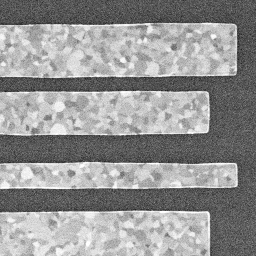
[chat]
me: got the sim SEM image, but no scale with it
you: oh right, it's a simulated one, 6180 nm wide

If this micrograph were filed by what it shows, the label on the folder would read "groups of lines, slits or small figures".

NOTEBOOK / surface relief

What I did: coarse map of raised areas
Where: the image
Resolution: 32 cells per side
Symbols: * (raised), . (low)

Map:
................................
................................
................................
*****************************...
******************************..
******************************..
******************************..
******************************..
*****************************...
...********.....................
................................
...............******..***......
**************************......
**************************......
**************************......
**************************......
**************************......
................................
................................
................................
.****..***************......*...
******************************..
******************************..
.......****....****.............
................................
................................
........**....*********.........
**************************......
**************************......
**************************......
**************************......
**************************......